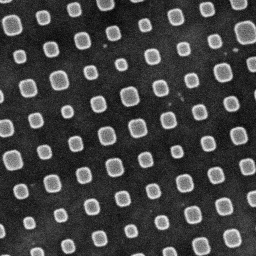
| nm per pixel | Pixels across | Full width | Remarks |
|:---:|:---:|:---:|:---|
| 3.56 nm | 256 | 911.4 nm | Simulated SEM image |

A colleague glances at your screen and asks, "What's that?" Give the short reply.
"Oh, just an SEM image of a regular array of raised bodies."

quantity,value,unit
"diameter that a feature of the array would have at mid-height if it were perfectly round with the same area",53.6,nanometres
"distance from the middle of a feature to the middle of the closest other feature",114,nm